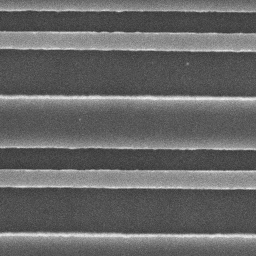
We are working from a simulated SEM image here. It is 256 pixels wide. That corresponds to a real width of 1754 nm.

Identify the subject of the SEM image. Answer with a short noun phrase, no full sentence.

lines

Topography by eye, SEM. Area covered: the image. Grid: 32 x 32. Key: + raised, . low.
++++++++++++++++++++++++++++++++
................................
................................
................................
++++++++++++++++++++++++++++++++
++++++++++++++++++++++++++++++++
................................
................................
................................
................................
................................
................................
++++++++++++++++++++++++++++++++
++++++++++++++++++++++++++++++++
++++++++++++++++++++++++++++++++
++++++++++++++++++++++++++++++++
++++++++++++++++++++++++++++++++
++++++++++++++++++++++++++++++++
........++.....+++++++++++++++++
................................
................................
++++++++++++++++++++++++++++++++
++++++++++++++++++++++++++++++++
...........................+++++
................................
................................
................................
................................
................................
+++++++++++++++++++++++++++++++.
++++++++++++++++++++++++++++++++
++++++++++++++++++++++++++++++++